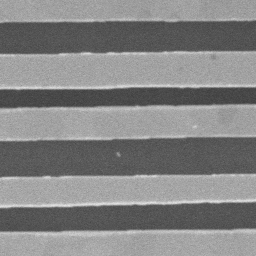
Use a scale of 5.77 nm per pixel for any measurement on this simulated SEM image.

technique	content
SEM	lines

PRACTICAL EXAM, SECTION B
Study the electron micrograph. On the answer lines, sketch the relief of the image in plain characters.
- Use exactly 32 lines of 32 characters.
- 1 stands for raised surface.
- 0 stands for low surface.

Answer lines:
11111111111111111111111111111111
11111111111111111111111111111111
11111111111111111111111111111100
00000000000000000000000000000000
00000000000000000000000000000000
00000000000000000000000000000000
00000000000000000000000000000000
11111111111111111111111111111111
11111111111111111111111111111111
11111111111111111111111111111111
11111111111111111111111111111111
00000000000000000000000000000000
00000000000000000000000000000000
00000011111111111111111111111111
11111111111111111111111111111111
11111111111111111111111111111111
11111111111111111111111111111111
11110000000000000000000000000000
00000000000000000000000000000000
00000000000000000000000000000000
00000000000000000000000000000000
00000000000000000000000000000000
11111111111111111111111111111111
11111111111111111111111111111111
11111111111111111111111111111111
11111111111111100000000000000000
00000000000000000000000000000000
00000000000000000000000000000000
00000000000000000000000000000000
11111111111111111111111111111111
11111111111111111111111111111111
11111111111111111111111111111111